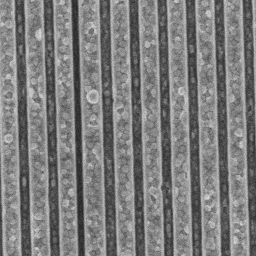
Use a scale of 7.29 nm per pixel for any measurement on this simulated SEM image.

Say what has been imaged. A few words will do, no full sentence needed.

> parallel lines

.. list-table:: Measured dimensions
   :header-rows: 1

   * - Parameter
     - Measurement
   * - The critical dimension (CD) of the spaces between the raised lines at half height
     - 71.9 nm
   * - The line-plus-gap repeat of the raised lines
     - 207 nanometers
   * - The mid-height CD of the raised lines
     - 0.136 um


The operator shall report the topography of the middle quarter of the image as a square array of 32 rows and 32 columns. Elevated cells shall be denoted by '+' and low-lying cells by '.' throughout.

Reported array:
++..+++++...+++++..+++++..+++++.
++..+++++...+++++..+++++..+++++.
++..+++++...+++++..+++++..+++++.
++..+++++...+++++..+++++..+++++.
++..+++++...+++++..+++++..+++++.
++..+++++...+++++..+++++..+++++.
++..+++++...+++++..+++++..+++++.
++..+++++...+++++..+++++...++++.
++..+++++...+++++..+++++...++++.
++..+++++....++++..+++++...++++.
++...++++...+++++..+++++...++++.
++...++++...+++++...++++...++++.
++...++++...+++++...++++...++++.
++...+++++..+++++...++++...++++.
++...+++++..+++++...++++...++++.
++...+++++..+++++...++++...++++.
+++..+++++...++++...++++...++++.
+++..+++++...++++...++++...++++.
+++..+++++...++++...++++...++++.
+++..+++++...++++...++++...++++.
+++..+++++...++++...++++...++++.
+++..+++++...++++...++++...++++.
+++..+++++...++++...++++...++++.
+++..+++++...++++...++++...++++.
+++..+++++...++++...++++...++++.
+++..+++++...++++...++++...++++.
+++..+++++...++++...++++...++++.
+++..+++++...++++...++++...++++.
+++..+++++...++++...++++...++++.
+++..+++++...++++...++++...+++++
+++..+++++...++++...++++...++++.
+++..+++++...++++...++++...++++.